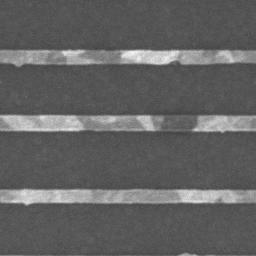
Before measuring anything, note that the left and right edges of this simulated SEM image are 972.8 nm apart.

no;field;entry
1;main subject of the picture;one or a few lines or trenches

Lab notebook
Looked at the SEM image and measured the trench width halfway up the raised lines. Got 206 nanometres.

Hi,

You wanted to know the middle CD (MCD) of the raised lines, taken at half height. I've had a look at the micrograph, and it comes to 13.1 px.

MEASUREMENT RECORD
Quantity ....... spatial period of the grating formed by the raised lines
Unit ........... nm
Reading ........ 264